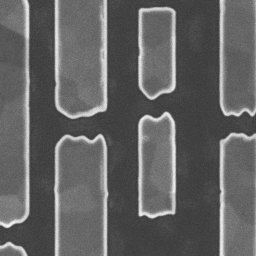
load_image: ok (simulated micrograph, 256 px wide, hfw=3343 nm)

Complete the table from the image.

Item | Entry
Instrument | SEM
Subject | one or a few lines or trenches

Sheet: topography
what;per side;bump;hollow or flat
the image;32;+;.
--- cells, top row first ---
+++....++++++...............++++
+++....++++++.....++++......++++
+++....++++++.....++++......++++
+++....++++++.....++++......++++
+++....++++++.....++++......++++
+++....++++++.....++++......++++
+++....++++++.....++++......++++
+++....++++++.....++++......++++
+++....++++++.....++++......++++
+++....++++++.....++++......++++
+++....++++++.....++++......++++
+++....++++++.....+++.......++++
+++....++++++...............++++
+++....++++++...............++++
+++.....++..........+...........
+++..............+++++..........
+++..............+++++..........
+++.....+++.+.....++++......++++
+++....++++++....+++++......++++
+++....++++++.....++++......++++
+++....++++++.....++++......++++
+++....++++++.....++++......++++
+++....++++++....+++++......++++
+++....++++++....+++++......++++
+++....++++++....+++++......++++
+++....++++++....+++++......++++
+++....++++++.....+++.......++++
+++....++++++...............++++
.......++++++...............++++
.......++++++...............++++
.......++++++...............++++
+++....++++++...............++++